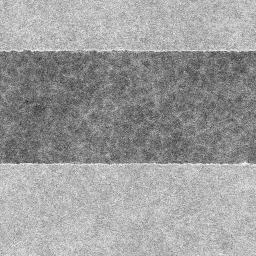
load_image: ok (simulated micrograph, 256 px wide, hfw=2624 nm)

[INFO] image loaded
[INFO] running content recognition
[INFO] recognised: one or a few lines or trenches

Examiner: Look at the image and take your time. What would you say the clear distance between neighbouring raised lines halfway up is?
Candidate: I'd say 1160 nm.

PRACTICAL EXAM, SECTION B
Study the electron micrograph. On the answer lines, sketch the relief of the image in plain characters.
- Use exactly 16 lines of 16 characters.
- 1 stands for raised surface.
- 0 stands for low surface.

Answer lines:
1111111111111111
1111111111111111
1111111111111111
0000000000000000
0000000000000000
0000000000000000
0000000100000000
0000000000000000
0000000000000000
0000000000000000
1111111111111111
1111111111111111
1111111111111111
1111111111111111
1111111111111111
1111111111111111